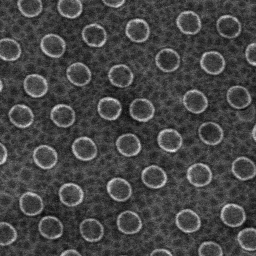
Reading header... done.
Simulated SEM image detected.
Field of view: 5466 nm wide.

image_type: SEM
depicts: a regular array of raised bodies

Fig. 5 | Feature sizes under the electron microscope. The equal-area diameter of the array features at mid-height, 484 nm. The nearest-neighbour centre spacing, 821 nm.